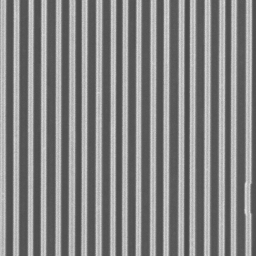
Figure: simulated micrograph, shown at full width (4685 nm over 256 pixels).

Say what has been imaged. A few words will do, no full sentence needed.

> parallel lines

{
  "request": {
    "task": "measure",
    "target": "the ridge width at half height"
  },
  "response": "112 nanometres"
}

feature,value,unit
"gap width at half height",0.146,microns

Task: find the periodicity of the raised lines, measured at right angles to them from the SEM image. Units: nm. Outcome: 250